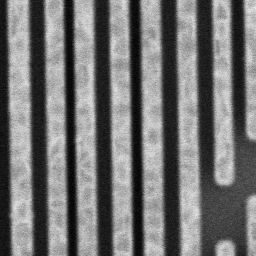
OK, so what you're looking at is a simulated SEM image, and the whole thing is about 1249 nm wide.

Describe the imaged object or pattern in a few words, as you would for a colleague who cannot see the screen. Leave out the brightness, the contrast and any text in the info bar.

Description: parallel lines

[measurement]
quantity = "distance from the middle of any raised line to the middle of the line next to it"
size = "0.165 microns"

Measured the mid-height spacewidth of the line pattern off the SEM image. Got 69.6 nanometres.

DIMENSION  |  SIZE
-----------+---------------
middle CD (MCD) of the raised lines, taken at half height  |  102 nanometres